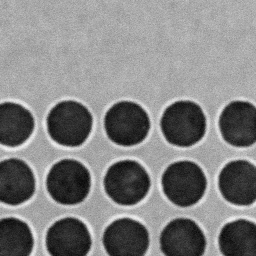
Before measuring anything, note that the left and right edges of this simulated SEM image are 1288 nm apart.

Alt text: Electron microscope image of holes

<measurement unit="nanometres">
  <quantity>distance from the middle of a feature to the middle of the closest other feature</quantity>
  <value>288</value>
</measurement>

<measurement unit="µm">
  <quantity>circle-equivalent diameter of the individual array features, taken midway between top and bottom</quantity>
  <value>0.246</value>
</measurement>